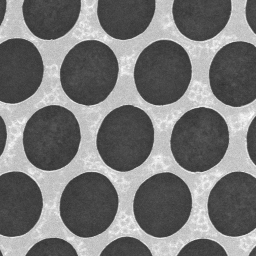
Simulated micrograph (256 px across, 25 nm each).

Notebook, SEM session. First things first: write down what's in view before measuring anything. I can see holes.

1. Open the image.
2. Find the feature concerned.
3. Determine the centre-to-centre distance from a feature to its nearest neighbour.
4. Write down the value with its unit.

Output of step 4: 73.8 px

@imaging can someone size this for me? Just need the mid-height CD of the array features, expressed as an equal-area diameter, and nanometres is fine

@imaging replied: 1550